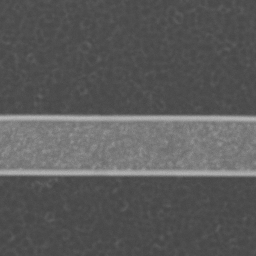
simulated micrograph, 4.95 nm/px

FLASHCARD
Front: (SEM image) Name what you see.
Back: one or a few lines or trenches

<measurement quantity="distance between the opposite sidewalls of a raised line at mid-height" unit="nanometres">270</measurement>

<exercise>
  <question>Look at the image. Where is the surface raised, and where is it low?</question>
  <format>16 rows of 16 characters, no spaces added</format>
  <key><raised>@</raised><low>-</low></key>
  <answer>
----------------
----------------
----------------
----------------
----------------
----------------
----------------
@@@@@@@@@@@@@@@@
@@@@@@@@@@@@@@@@
@@@@@@@@@@@@@@@@
@@@@@@@@@@@@@@@@
----------------
----------------
----------------
----------------
----------------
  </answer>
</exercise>